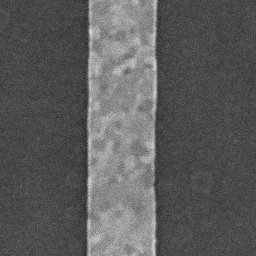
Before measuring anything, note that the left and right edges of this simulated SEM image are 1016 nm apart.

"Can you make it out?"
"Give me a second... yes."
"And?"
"one or a few lines or trenches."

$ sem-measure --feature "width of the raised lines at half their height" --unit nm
260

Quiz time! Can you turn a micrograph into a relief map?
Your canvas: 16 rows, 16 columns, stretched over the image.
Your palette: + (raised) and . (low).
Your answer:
......++++......
......++++......
......++++......
......++++......
......++++......
......++++......
......++++......
......++++......
......++++......
......++++......
......++++......
......++++......
......++++......
......++++......
......++++......
......++++......